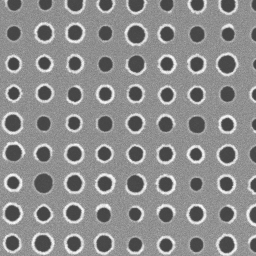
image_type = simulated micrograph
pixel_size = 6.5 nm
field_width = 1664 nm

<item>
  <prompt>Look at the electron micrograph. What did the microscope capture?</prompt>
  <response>a regular array of holes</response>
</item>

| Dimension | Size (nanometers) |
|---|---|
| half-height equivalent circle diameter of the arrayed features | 93.9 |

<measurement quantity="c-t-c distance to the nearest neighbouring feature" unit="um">0.194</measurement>